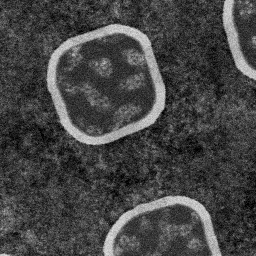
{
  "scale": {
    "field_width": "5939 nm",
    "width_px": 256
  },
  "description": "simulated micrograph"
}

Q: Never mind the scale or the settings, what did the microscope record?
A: raised bodies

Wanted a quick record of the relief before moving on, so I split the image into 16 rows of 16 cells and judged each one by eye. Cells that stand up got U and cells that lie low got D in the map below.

DDDDDDDDDDDDDDUU
DDDDDDDDDDDDDDUU
DDDDDUUUUDDDDDDU
DDDDUUUUUDDDDDDU
DDDUUUUUUUDDDDDD
DDDUUUUUUUDDDDDD
DDDDUUUUUUDDDDDD
DDDDUUUUUDDDDDDD
DDDDDUUDDDDDDDDD
DDDDDDDDDDDDDDDD
DDDDDDDDDDDDDDDD
DDDDDDDDDDDDDDDD
DDDDDDDDDDDDDDDD
DDDDDDDDUUUUUDDD
DDDDDDDUUUUUUDDD
DDDDDDDUUUUUUDDD